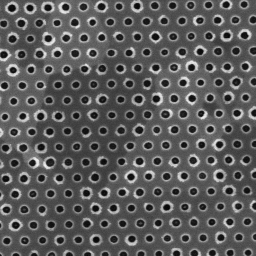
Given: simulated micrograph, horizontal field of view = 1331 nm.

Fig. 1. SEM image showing a regular array of holes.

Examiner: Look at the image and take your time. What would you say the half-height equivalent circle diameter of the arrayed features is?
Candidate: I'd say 39.8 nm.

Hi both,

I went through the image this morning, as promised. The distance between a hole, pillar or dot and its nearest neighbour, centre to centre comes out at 91.3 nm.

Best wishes